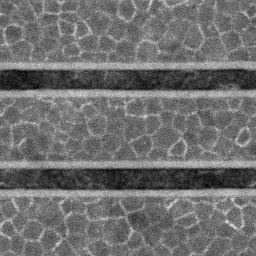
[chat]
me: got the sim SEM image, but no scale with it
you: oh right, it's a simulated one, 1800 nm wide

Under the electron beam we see one or a few lines or trenches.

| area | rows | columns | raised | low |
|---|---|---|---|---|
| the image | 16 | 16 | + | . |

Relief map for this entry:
++++++++++++++++
++++++++++++++++
++++++++++++++++
++++++++++++++++
................
................
++++++++++++++++
++++++++++++++++
++++++++++++++++
++++++++++++++++
................
................
++++++++++++++++
++++++++++++++++
++++++++++++++++
++++++++++++++++